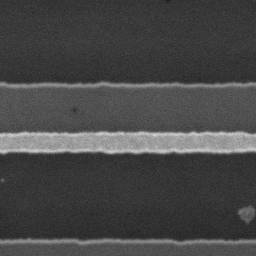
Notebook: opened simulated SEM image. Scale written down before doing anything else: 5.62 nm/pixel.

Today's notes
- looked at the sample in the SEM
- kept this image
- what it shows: lines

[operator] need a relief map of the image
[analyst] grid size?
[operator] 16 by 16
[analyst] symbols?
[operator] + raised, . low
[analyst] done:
................
................
................
................
................
++++++++++++++++
++++++++++++++++
++++++++++++++++
++++++++++++++++
.......+........
................
................
................
................
................
++++++++++++++++